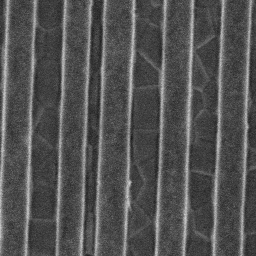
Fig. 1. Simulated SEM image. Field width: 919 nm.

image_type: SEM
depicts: parallel lines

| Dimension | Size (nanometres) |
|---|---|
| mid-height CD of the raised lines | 102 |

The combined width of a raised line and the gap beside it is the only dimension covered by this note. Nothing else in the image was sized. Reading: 192 nm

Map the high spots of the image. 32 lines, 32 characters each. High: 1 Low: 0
01110000111001111000011100001110
01110000111001111000011100001110
01110000111001111000011100001110
01110000111001111000011100001110
01110000111001111000111100001110
01110000111001111000111100001110
01110000111001111000111100001110
01110000111001111000111100001110
01110000111001110000111100011110
01110000111001110000111100011110
01110000111001110000111100001110
11110000111001110000111100011110
11110000111001110000111100011110
11110000111001110000111100011110
11110000111001110000111100011110
11110000111001110000111100011110
11110000111001110000111100011110
11110000111011110000111100011110
11110001111011110000111100011110
11110001111011110000111000011110
11110001111011110000111000011110
11110001111011110000111000011110
11110001111011110000111000011110
11110001111011110000111000011100
11110001110011110000111000011100
11110001110011110000111000011100
11110001110011110000111000011100
11100001110011110000111000011100
11100001110011110000111000011100
11100001110011110000111000011100
11100001110011110000111000011100
11100001110011110000111000011100